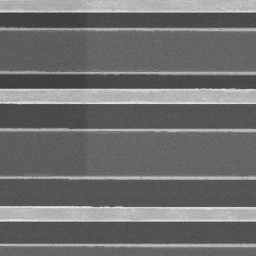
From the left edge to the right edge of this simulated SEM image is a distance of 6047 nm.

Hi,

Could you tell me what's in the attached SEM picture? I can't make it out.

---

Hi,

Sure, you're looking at lines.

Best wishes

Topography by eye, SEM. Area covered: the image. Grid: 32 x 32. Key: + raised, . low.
++++++++++++++++++++++++++++++++
................................
................................
................................
++++++++++++++++++++++++++++++++
++++++++++++++++++++++++++++++++
++++++++++++++++++++++++++++++++
++++++++++++++++++++++++++++++++
++++++++++++++++++++++++++++++++
................................
................................
++++++++++++++++++++++++++++++++
++++++++++++++++++++++++++++++++
................................
................................
................................
++++++++++++++++++++++++++++++++
++++++++++++++++++++++++++++++++
++++++++++++++++++++++++++++++++
++++++++++++++++++++++++++++++++
++++++++++++++++++++++++++++++++
++++++++++++++++++++++++++++++++
................................
................................
................................
................................
++++++++++++++++++++++++++++++++
++++++++++++++++++++++++++++++++
................................
................................
................................
++++++++++++++++++++++++++++++++